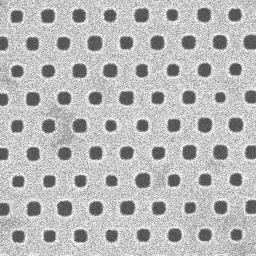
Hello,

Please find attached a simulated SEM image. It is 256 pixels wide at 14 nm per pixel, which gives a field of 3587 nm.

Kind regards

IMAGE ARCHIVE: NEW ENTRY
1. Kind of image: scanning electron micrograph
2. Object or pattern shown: a regular array of holes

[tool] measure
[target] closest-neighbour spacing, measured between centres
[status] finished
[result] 434 nanometers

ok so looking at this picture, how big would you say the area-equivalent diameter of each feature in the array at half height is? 206 nm